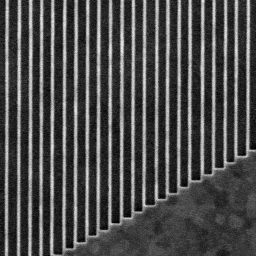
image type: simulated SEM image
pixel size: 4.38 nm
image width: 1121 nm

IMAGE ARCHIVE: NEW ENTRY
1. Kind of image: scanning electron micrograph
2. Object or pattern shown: parallel lines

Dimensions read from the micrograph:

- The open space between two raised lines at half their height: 38.3 nanometers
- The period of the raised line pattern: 0.0502 micrometres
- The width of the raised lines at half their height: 10.9 nanometers